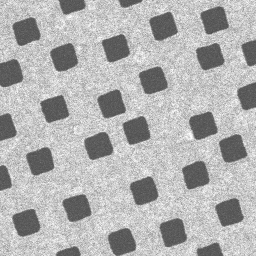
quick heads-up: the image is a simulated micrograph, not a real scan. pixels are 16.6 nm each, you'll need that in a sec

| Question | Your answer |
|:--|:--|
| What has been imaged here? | a regular array of holes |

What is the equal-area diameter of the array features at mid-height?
457 nanometres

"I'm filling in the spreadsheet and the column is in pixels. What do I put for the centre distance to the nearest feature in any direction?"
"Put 47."